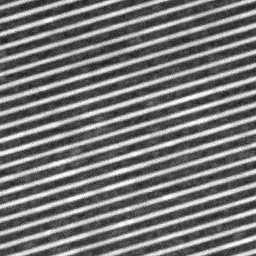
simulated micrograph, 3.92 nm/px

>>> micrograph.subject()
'parallel lines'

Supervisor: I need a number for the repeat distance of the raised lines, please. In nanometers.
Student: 49.9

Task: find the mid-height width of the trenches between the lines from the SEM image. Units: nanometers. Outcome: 39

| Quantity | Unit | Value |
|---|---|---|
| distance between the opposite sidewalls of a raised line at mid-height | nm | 11.3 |